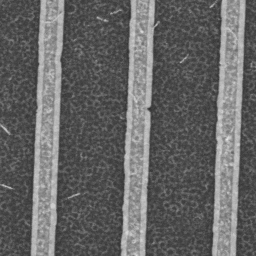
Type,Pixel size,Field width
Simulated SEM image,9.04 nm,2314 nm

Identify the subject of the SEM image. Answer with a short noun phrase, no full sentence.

one or a few lines or trenches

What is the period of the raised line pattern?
90.5 pixels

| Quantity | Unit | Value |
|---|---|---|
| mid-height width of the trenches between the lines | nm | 652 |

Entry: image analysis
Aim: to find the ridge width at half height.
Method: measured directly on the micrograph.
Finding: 166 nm